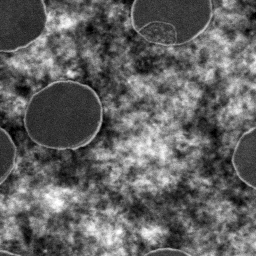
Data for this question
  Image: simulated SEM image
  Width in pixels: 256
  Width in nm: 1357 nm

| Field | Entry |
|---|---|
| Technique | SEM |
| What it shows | raised bodies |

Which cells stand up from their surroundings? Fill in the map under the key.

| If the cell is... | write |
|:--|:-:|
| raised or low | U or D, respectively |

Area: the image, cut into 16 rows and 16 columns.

UUUDDDDDUUUUUDDD
UUUDDDDDUUUUUDDD
UUDDDDDDDDDUDDDD
DDDDDDDDDDDDDDDD
DDDDDDDDDDDDDDDD
DDDUUUDDDDDDDDDD
DDUUUUDDDDDDDDDD
DDUUUUDDDDDDDDDD
UDUUUUDDDDDDDDDU
UDDDDDDDDDDDDDDU
UDDDDDDDDDDDDDDU
DDDDDDDDDDDDDDDU
DDDDDDDDDDDDDDDD
DDDDDDDDDDDDDDDD
DDDDDDDDDDDDDDDD
DDDDDDDDDDDDDDDD